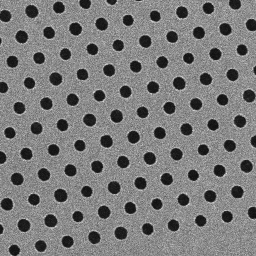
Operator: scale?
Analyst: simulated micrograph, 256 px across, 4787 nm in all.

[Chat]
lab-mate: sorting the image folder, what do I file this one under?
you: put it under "a regular array of holes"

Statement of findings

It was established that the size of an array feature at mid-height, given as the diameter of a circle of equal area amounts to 12.3 pixels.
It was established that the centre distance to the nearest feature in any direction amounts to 495 nm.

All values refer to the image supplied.